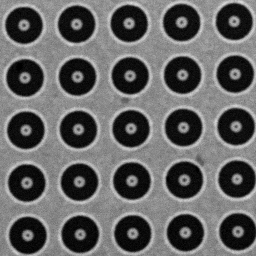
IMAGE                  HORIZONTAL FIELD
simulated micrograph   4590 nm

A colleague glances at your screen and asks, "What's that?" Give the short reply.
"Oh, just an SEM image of an array of small figures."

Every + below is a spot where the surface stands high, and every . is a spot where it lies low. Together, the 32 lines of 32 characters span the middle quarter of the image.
........++++.........++++.......
........++++.........++++.......
...+....++++....+.....+++....++.
...+....++++....+.....+++....+..
........++++.........++++.......
........++++.........+++++......
.......++++++.......++++++......
+.....++++++++....++++++++++....
++++++++++++++++++++++++++++++++
++++++++++++++++++++++++++++++++
++++++++++++++++++++++++++++++++
++...++++++++++....++++++++.....
.......++++++.......++++++......
........++++.........++++.......
........++++.........++++.......
.........+++....+.....+++....++.
...+.....+++....++....+++....++.
........++++..........+++.......
........++++.........+++++......
.......++++++.......++++++......
+.....++++++++.....+++++++++....
++++++++++++++++++++++++++++++++
++++++++++++++++++++++++++++++++
++++++++++++++++++++++++++++++++
+++.+++++++++++...++++++++++....
+......+++++++......+++++++.....
........+++++........+++++......
........++++..........+++.......
.........+++....++....+++....++.
...++....+++....++....+++....++.
.........+++..........+++.......
........+++++.........++++......